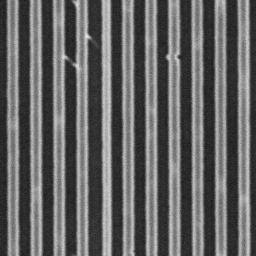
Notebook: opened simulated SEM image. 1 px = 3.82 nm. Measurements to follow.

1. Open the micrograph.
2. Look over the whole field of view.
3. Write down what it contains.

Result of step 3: parallel lines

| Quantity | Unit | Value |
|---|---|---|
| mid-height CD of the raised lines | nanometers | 36.8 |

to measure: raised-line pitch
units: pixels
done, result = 23.1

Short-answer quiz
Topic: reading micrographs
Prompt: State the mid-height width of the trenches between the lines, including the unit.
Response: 0.0506 um